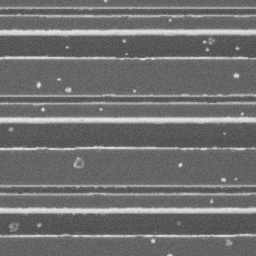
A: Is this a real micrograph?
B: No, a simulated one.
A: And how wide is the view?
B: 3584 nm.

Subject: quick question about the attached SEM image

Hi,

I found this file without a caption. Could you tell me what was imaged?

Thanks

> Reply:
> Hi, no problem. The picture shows lines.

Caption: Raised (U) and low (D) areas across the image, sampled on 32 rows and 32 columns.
UUUUUUUUUUUUUUUUUUUUUUUUUUUUUUUU
UUUUUUUUUUUUUUUUUUUUUUUUUUUUUUUU
UUUUUUUUUUUUUUUUUUUUUUUUUUUUUUUU
UUUUUUUUUUUUUUUUUUUUUUUUUUUUUUUU
DDDDDDDDDDDDDDDDDDDDDDDDDDDDDDDD
DDDDDDDDDDDDDDDDDDDDDDDDDDDDDDDD
DDDDDDDDDDDDDDDDDDDDDDDDDDDDDDDD
UUUUUUUUUUUUUUUUUUUUUUUUUUUUUUUU
UUUUUUUUUUUUUUUUUUUUUUUUUUUUUUUU
UUUUUUUUUUUUUUUUUUUUUUUUUUUUUUUU
UUUUUUUUUUUUUUUUUUUUUUUUUUUUUUUU
UUUUUUUUUUUUUUUUUUUUUUUUUUUUUUUU
UUUUUUUUUUUUUUUUUUUUUUUUUUUUUUUU
UUUUUUUUUUUUUUUUUUUUUUUUUUUUUUUU
UUUUUUUUUUUUUUUUUUUUUUUUUUUUUUUU
DDDDDDDDDDDDDDDDDDDDDDDDDDDDDDDD
DDDDDDDDDDDDDDDDDDDDDDDDDDDDDDDD
DDDDDDDDDDDDDDDDDDDDDDDDDDDDDDDD
DDDDDDDDDDDUUUUDDDDDDDDDDDDDDDDD
UUUUUUUUUUUUUUUUUUUUUUUUUUUUUUUU
UUUUUUUUUUUUUUUUUUUUUUUUUUUUUUUU
UUUUUUUUUUUUUUUUUUUUUUUUUUUUUUUU
UUUUUUUUUUUUUUUUUUUUUUUUUUUUUUUU
UUUUUUUUUUUUUUUUUUUUUUUUUUUUUUUU
UUUUUUUUUUUUUUUUUUUUUUUUUUUUUUUU
UUUUUUUUUUUUUUUUUUUUUUUUUUUUUUUU
DDDDDDDDDDDDDDDDDDDDDDDDDDDDDDDD
DDDDDDDDDDDDDDDDDDDDDDDDDDDDDDDD
DDDDDDDDDDDDDDDDDDDDDDDDDDDDDDDD
DDDDUUUUUUUDDUDDUUUUDDDDUUUUDUUU
UUUUUUUUUUUUUUUUUUUUUUUUUUUUUUUU
UUUUUUUUUUUUUUUUUUUUUUUUUUUUUUUU